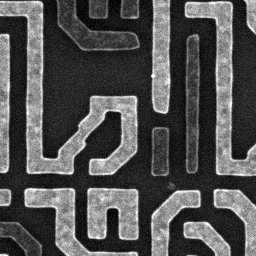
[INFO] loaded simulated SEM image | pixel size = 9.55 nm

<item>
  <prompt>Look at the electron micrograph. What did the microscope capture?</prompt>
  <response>wiring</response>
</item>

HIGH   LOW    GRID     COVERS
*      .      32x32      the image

*****..**..**..**..**..******..*
*****..**..**..**..**..******..*
...**..***.........**......**..*
....*...***........**......**..*
*...*....********..**...*..**...
*..**.....*******..**..**..**...
*..**..............**..**..**...
*..**..............**..**..**...
*..**..............**..**..**...
*..**..............**..**..**...
*..**..............**..**..**...
*..**..............**..**..**...
*..**......******..**..**..**...
*..**......******..**..**..**...
*..**......**..**......**..**...
*..**.....**...**......**..**...
*..**.....*....**..**..**..**...
*..**....**....**..**..**..**...
*..**...**.....**..**..**..**..*
*..***.**.....***..**..**..**..*
*..******..****....**..**..*****
*...*****..***.....**......*****
................................
................................
*..******..******....****..****.
*..******..******...*****..*****
.......**..**..**..***.......***
.......**..**..**..**.........**
***....**..**..**..**..****....*
****...**..**..**..**..*****...*
..***..***.........**.....**...*
...**...****.......**......**..*